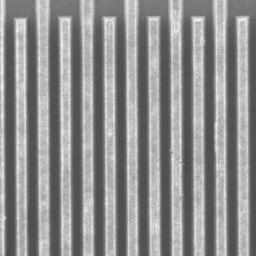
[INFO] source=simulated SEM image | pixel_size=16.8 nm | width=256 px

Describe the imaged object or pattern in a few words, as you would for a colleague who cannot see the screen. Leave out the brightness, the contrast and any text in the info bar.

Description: parallel lines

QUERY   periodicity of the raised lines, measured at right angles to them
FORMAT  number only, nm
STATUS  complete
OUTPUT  371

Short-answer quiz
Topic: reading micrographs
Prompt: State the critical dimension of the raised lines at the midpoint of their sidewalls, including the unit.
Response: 197 nm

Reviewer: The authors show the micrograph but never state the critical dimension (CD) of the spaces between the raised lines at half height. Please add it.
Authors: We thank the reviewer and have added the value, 182 nm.